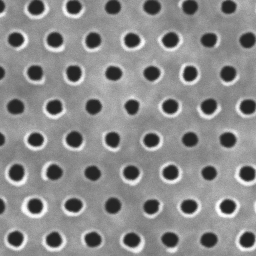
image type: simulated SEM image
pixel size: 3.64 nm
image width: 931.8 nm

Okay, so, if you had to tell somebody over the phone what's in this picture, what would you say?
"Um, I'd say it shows a regular array of holes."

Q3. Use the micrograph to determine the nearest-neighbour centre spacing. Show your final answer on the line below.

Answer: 138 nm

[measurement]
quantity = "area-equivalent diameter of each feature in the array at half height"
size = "55 nanometres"